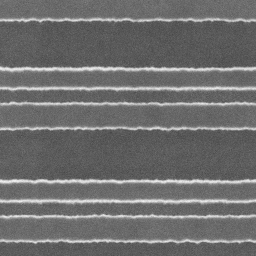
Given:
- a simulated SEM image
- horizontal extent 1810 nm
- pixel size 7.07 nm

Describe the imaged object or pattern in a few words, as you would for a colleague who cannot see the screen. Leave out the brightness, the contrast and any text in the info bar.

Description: lines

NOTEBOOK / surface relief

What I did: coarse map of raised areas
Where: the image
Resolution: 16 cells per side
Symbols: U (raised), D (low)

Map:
UUUUUUUUUUUUUUUU
DDDDDDDDDDDDDDDD
DDDDDDDDDDDDDDDD
DDDDDDDDDDDDDDDD
UUUUUUUUUUUUUUUU
UUUUUUUUUUUUUUUU
UUUUUUUUUUUUUUUU
UUUUUUUUUUUUUUUU
DDDDDDDDDDDDDDDD
DDDDDDDDDDDDDDDD
DDDDDDDDDDDDDDDD
UUUUUUUUUUUUUUUU
UUUUUUUUUUUUUUUU
UUUUUUUUUUUUUUUU
UUUUUUUUUUUUUUUU
DDDDDDDDDDDDDDDD